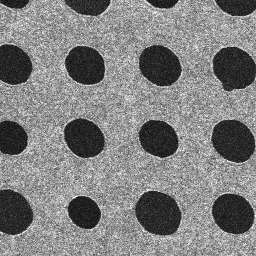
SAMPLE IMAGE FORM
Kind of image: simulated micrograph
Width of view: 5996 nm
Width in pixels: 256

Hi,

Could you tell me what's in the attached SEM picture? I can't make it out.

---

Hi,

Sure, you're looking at a regular array of holes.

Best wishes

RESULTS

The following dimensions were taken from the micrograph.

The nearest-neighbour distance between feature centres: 1.71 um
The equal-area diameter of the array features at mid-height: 956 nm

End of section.